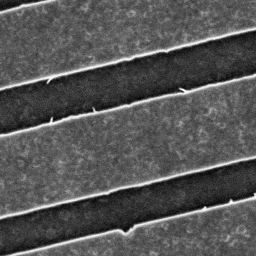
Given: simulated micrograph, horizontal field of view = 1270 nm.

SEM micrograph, one or a few lines or trenches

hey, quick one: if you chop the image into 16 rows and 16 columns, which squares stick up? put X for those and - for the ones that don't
-XXXXXXXXXXXXXXX
XXXXXXXXXXXXXXXX
XXXXXXXXXXXXX---
XXXXXXXXX-------
XXXXX-----------
-------------XXX
--------XXXXXXXX
----XXXXXXXXXXXX
XXXXXXXXXXXXXXXX
XXXXXXXXXXXXXXXX
XXXXXXXXXXXXX---
XXXXXXXXX-------
XXXXX----------X
-----------XXXXX
-------XXXXXXXXX
---XXXXXXXXXXXXX